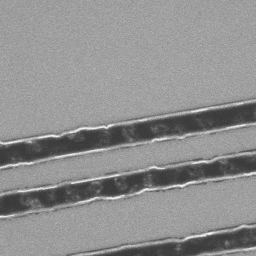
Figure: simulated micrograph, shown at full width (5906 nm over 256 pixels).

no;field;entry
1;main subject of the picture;one or a few lines or trenches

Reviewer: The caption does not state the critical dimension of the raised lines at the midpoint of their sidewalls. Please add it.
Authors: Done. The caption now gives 0.54 um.